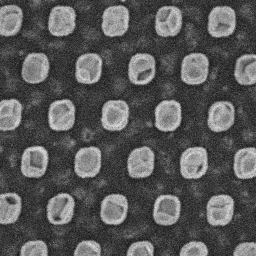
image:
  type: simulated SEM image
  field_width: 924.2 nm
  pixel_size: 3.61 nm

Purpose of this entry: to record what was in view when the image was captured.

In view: a regular array of raised bodies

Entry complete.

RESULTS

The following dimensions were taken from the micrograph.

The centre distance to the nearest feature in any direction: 53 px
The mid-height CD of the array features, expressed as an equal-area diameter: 103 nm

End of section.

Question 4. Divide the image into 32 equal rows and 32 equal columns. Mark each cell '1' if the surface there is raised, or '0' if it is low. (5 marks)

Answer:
00000000000000000000000000000000
11100011100001110000110000011000
11100011100001110000111000111000
11000011100001110000110000111000
00000000000000000000000000010000
00000000000000000000000000000000
00000000000000000000000000000000
00011100001110001110000111000011
00011100001110001110000111000111
00011100001100001110000111000111
00000000000000000000000000000000
00000000000000000000000000000000
00000000000000000000000000000000
11100011100001110000110000111000
11000011100001110000110000111000
11000011100001110000110000111000
00000000000000000000000000000000
00000000000000000000000000000000
00001000000000000000000000000000
00011100001100001110000111000011
00011100011100001110000111000111
00011000001100001110000110000111
00000000000000000000000000000000
00000000000000000000000000000000
11000001100000100000110000000000
11100011100001110001110000111000
11000011100001110001110000111000
11000011100001100001110000111000
00000000000000000000000000000000
00000000000000000000000000000000
00011000001100000110000010000011
00011100011100001110000111000111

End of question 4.